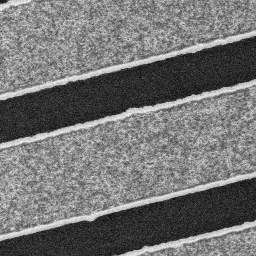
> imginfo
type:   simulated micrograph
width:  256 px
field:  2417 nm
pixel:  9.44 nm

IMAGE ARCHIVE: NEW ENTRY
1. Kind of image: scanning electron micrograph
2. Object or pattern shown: one or a few lines or trenches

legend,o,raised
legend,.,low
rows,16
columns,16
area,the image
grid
oooooooooooooooo
oooooooooooooooo
oooooooooooooo..
ooooooooooo.....
oooooo..........
oo.............o
...........ooooo
......oooooooooo
...ooooooooooooo
oooooooooooooooo
oooooooooooooooo
oooooooooooooo..
oooooooooo......
oooooo..........
oo............oo
..........oooooo